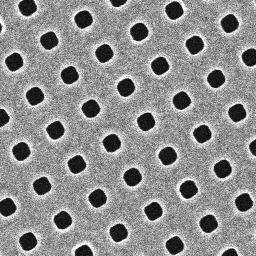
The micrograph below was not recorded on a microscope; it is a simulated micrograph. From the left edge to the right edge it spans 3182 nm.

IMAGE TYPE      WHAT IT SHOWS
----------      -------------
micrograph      a regular array of holes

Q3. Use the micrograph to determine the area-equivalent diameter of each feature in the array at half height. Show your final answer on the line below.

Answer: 226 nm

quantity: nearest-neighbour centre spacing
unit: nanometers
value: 496